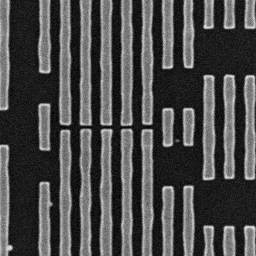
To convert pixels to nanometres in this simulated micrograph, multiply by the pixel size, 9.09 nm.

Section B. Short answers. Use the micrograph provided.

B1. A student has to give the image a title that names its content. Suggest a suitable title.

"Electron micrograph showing wiring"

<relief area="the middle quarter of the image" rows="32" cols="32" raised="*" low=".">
*...**...***..***...**...**...**
*...**...***..***...**..........
*...**...***..***...**..........
*...**...***..***...**..........
*...**...***..***...**..........
*...***..***..***...**..........
*...***..***..***...**..........
*...**...***..***...**..........
**..**...***...**...**..........
**..**...***...**...**..........
**..**...***...**...**..........
**..**...***...**...**...**...**
**..***..***..***...**...**...**
**..***..***..***...**...**...**
**..***..***..***...**...**...**
.........................**...**
.....*....**...**....*...**...**
*...***..***..***...**...**...**
*...***...**..***...**...**...**
*...**....*...***...**...**...**
*...**....**..***...**..........
**..***...**..***...**..........
**..***..***...**...**..........
**..***..**...***...**..........
**..***..**...***...**..........
**..**...**...***...**..........
*...**....*...***...**..........
*...**....**..***...**..........
*....*...***..***...**..........
*....*...***...**...**..........
*....*...***...**...**..........
*...**...***...**...**...**...**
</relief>